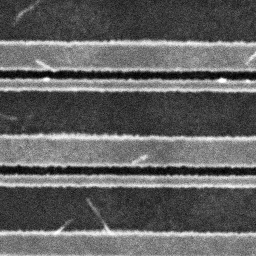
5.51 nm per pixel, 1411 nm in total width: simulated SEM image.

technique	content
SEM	lines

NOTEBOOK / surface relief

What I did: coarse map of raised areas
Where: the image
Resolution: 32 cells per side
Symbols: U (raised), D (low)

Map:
DDDDDDDDDDDDDDDDDDDDDDDDDDDDDDDD
DDDDDDDDDDDDDDDDDDDDDDDDDDDDDDDD
DDDDDDDDDDDDDDDDDDDDDDDDDDDDDDDD
DDDDDDDDDDDDDDDDDDDDDDDDDDDDDDDD
DDDDDDDDDDDDDDDDDDDDDDDDDDDDDDDD
UUUUUUUUUUUUUUUUUUUUUUUUUUDUDUUD
UUUUUUUUUUUUUUUUUUUUUUUUUUUUUUUU
UUUUUUUUUUUUUUUUUUUUUUUUUUUUUUUU
UUUUUUUUUUUUUUUUUUUUUUUUUUUUUUUU
UUUUUUUUUUUUUUUUUUUUUUUUUUUUUUUU
UUUUUUUUUUUUUUUUUUUUUUUUUUUUUUUU
DDDDDDDDDDDDDDDDDDDDDDDDDDDDDDDD
DDDDDDDDDDDDDDDDDDDDDDDDDDDDDDDD
DDDDDDDDDDDDDDDDDDDDDDDDDDDDDDDD
DDDDDDDDDDDDDDDDDDDDDDDDDDDDDDDD
DDDDDDDDDDDDDDDDDDDDDDDDDDDDDDDD
DDDDDDDDDDDDDDDDDDDDDDDDDDDDDDDD
UUUUUUUUUUUUUUUUUUUUUUUUUUUUUUUU
UUUUUUUUUUUUUUUUUUUUUUUUUUUUUUUU
UUUUUUUUUUUUUUUUUUUUUUUUUUUUUUUU
UUUUUUUUUUUUUUUUUUUUUUUUUUUUUUUU
UUUUUUUUUUUUUUUUUUUUUUUUUUUUUUUU
UUUUUUUUUUUUUUUUUUUUUUUUUUUUUUUU
DDDDDDDDDDDDDDDDDDDDDDDDDDDDDDDD
DDDDDDDDDDDDDDDDDDDDDDDDDDDDDDDD
DDDDDDDDDDDDDDDDDDDDDDDDDDDDDDDD
DDDDDDDDDDDDDDDDDDDDDDDDDDDDDDDD
DDDDDDDDDDDDDDDDDDDDDDDDDDDDDDDD
DDDDDDDDDDDDDDDDDDDDDDDDDDDDDDDD
UUUUUUUUUUUUUUUUUUUUUUUUUUUUUUUU
UUUUUUUUUUUUUUUUUUUUUUUUUUUUUUUU
UUUUUUUUUUUUUUUUUUUUUUUUUUUUUUUU